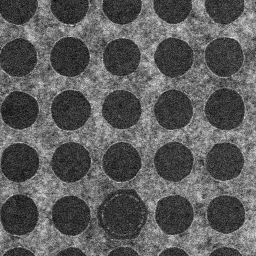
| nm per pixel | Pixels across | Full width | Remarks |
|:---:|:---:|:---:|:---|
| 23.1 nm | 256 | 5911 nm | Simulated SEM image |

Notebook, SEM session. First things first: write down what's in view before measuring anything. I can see a regular array of raised bodies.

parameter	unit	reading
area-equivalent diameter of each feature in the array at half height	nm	943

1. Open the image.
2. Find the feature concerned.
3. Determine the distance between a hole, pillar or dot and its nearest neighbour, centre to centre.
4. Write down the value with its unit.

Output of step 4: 1180 nm